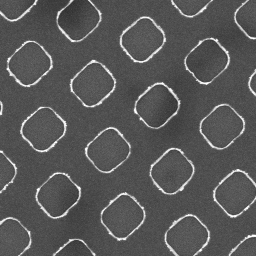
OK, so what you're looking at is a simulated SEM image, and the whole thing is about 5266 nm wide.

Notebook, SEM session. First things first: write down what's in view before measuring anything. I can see a regular array of holes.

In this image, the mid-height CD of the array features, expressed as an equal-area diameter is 821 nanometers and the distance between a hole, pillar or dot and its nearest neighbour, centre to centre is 1370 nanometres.